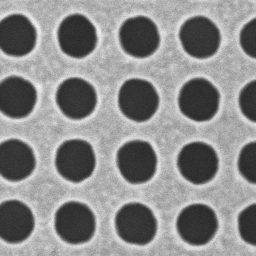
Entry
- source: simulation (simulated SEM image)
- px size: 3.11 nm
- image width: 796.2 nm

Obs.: a regular array of holes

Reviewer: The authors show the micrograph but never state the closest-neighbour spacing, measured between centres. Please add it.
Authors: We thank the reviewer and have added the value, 190 nm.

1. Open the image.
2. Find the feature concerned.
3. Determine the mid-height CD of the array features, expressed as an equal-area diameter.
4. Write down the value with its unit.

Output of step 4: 130 nm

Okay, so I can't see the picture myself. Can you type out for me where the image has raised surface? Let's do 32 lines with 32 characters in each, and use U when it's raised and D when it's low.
UUUUUUUUUUUUUUUUUUUUUUUUUUUUUUUU
UUUUUUUUUUUUUUUUUUUUUUUUUUUUUUUU
DDDDUUUUDDDUUUUUDDDUUUUDDDUUUUUD
DDDDUUUDDDDDUUUDDDDDUUUDDDDUUUDD
DDDDDUUDDDDDUUUDDDDDUUDDDDDDUUDD
DDDDUUUDDDDDUUUDDDDDUUUDDDDUUUDD
DDDDUUUUDDDUUUUUDDDUUUUDDDDUUUUD
UUUUUUUUUUUUUUUUUUUUUUUUUUUUUUUU
UUUUUUUUUUUUUUUUUUUUUUUUUUUUUUUU
UUUUUUUUUUUUUUUUUUUUUUUUUUUUUUUU
DDDDUUUUDDDUUUUDDDDUUUUDDDUUUUUD
DDDDUUUDDDDDUUUDDDDDUUDDDDDUUUDD
DDDDUUUDDDDDUUUDDDDDUUDDDDDUUUDD
DDDDUUUDDDDDUUUDDDDDUUDDDDDUUUDD
UDDUUUUUDDDUUUUUDDDUUUUDDDDUUUUD
UUUUUUUUUUUUUUUUUUUUUUUUUUUUUUUU
UUUUUUUUUUUUUUUUUUUUUUUUUUUUUUUU
UDUUUUUUUDUUUUUUUUUUUUUUUUUUUUUU
DDDDUUUDDDDUUUUDDDDUUUUDDDDUUUDD
DDDDUUUDDDDDUUUDDDDUUUDDDDDUUUDD
DDDDUUUDDDDDUUUDDDDDUUDDDDDUUUDD
DDDDUUUDDDDDUUUDDDDUUUUDDDDUUUDD
UDDUUUUUDDUUUUUUDDDUUUUDDDUUUUUD
UUUUUUUUUUUUUUUUUUUUUUUUUUUUUUUU
UUUUUUUUUUUUUUUUUUUUUUUUUUUUUUUU
DDDUUUUUDDUUUUUUDDUUUUUUDUUUUUUU
DDDDUUUDDDDUUUUDDDDUUUUDDDDUUUDD
DDDDUUUDDDDDUUDDDDDUUUDDDDDUUUDD
DDDDUUUDDDDDUUDDDDDDUUDDDDDUUUDD
DDDDUUUDDDDDUUUDDDDUUUUDDDDUUUDD
UUUUUUUUUUUUUUUUUDUUUUUUDDUUUUUD
UUUUUUUUUUUUUUUUUUUUUUUUUUUUUUUU